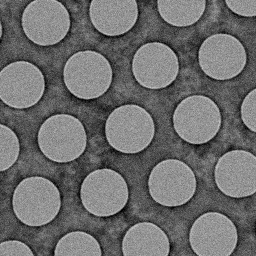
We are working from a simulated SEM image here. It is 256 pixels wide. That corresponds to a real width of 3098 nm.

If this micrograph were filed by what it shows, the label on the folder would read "an array of small figures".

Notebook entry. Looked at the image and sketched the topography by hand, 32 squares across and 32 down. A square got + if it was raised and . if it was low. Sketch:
....++++...++++++...++++++..++++
...+++++...++++++...+++++....+++
...++++++..++++++....++++.......
...++++++...++++................
...+++++...................++...
.....++...........++.....+++++..
..........++.....+++++...++++++.
.........++++....+++++...++++++.
.++++...++++++...+++++...+++++..
+++++...++++++...+++++....+++...
+++++...++++++....+++...........
+++++....++++..................+
+++++..................+++.....+
...............+++....+++++...++
.......++.....+++++...++++++..++
.....+++++...++++++...+++++....+
++...++++++..++++++...+++++.....
++...++++++...+++++....+++......
++...++++++...++++..............
++....++++..................++++
++..................+++....+++++
............++.....+++++...+++++
...+++.....++++....+++++...+++++
..+++++...++++++...+++++...+++++
..+++++...++++++...+++++.....++.
..+++++...++++++....+++.........
..+++++....++++.................
...+++...................++++...
................++++....+++++...
........+++.....+++++...++++++..
+++....+++++...++++++...++++++..
++++...++++++..++++++...+++++...